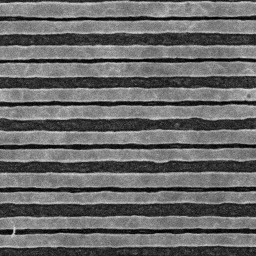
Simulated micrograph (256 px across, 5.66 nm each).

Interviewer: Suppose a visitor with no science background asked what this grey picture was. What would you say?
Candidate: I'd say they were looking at parallel lines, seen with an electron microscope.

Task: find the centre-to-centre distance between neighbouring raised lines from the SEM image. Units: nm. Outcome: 119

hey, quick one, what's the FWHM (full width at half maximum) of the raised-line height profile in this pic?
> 71.5 nanometers